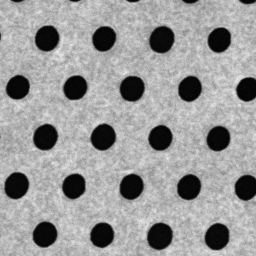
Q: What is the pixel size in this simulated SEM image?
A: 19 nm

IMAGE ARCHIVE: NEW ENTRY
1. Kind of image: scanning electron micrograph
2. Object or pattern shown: a regular array of holes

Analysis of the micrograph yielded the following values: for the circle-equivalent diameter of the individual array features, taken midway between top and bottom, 0.478 microns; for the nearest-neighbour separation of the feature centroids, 1070 nm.